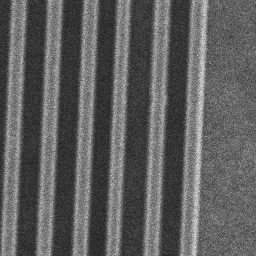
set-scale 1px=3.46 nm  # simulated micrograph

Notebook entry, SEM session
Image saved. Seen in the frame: parallel lines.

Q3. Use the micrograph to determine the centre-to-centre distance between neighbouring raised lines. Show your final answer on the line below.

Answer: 124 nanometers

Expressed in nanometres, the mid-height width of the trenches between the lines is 71.4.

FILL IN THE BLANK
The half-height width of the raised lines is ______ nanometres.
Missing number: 53.6